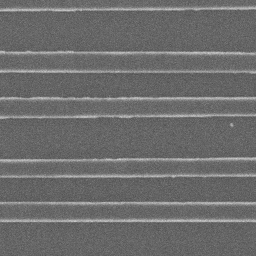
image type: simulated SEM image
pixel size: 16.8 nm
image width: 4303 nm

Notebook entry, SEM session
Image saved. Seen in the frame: lines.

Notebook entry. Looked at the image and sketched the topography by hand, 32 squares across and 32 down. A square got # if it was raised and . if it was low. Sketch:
################################
................................
................................
................................
................................
................................
#...............................
################################
################################
................................
................................
................................
################################
################################
#######################.........
................................
................................
................................
................................
................................
################################
################################
................................
................................
................................
################################
################################
################################
................................
................................
................................
................................